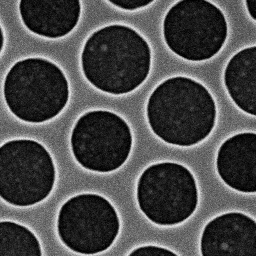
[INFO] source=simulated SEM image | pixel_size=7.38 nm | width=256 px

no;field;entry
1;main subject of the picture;holes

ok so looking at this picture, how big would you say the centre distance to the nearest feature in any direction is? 613 nanometers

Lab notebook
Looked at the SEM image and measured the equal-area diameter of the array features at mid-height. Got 469 nm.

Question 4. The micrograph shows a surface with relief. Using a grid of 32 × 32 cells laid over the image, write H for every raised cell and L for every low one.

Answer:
HHLLLLLLLLHHHHLLLLLHHHLLLLLHHHHL
HHHLLLLLLLHHHHHHHHHHHLLLLLLLHHHL
HHHLLLLLLLHHHHHHHHHHHLLLLLLLHHHH
HHHLLLLLLHHHHLLLHHHHLLLLLLLLHHHH
HHHHHHLLHHHLLLLLLLHHHLLLLLLLHHHH
HHHHHHHHHHHLLLLLLLHHHLLLLLLLHHHH
HHHHHHHHHHLLLLLLLLLHHHLLLLLHHHLL
HHHLLLHHHHLLLLLLLLLHHHHHLHHHHLLL
HLLLLLLHHHLLLLLLLLLHHHHHHHHHLLLL
HLLLLLLLHHHLLLLLLLHHHHHHHHHHLLLL
HLLLLLLLHHHHLLLLLLHHLLLLLHHHLLLL
HLLLLLLLLHHHHLLLHHHLLLLLLLHHHLLL
HLLLLLLLHHHHHHHHHHHLLLLLLLLHHLLL
HLLLLLLLHHHHHHHHHHLLLLLLLLLHHHLL
HHLLLLLHHHLLLLLHHHLLLLLLLLLHHHHH
HHHHHHHHHHLLLLLLHHHLLLLLLLLHHHHH
HHHHHHHHHLLLLLLLHHHLLLLLLLHHHHHH
HHHHHHHHHLLLLLLLHHHHLLLLLHHHLLLL
LLLLLLHHHLLLLLLLHHHHHHHHHHHHLLLL
LLLLLLHHHLLLLLLLHHHHHHHHHHHLLLLL
LLLLLLLHHHLLLLLHHHHHLLHHHHHLLLLL
LLLLLLLHHHHHHHHHHHLLLLLLHHHLLLLL
LLLLLLLHHHHHHHHHHLLLLLLLHHHHLLLL
LLLLLLHHHHHHHHHHHLLLLLLLLHHHHLLL
LLLLLLHHHHLLHHHHHLLLLLLLLHHHHHHH
HLLLHHHHLLLLLLHHHLLLLLLLLHHHHHHH
HHHHHHHLLLLLLLHHHHLLLLLLHHHHHHHH
HHHHHHHLLLLLLLLHHHHLLLLHHHHLLLLL
LLLHHHHLLLLLLLLHHHHHHHHHHHLLLLLL
LLLLHHHLLLLLLLLHHHHHHHHHHLLLLLLL
LLLLLHHHLLLLLLHHHHHHHHHHHLLLLLLL
LLLLLHHHHHLLHHHHHLLLLLHHHLLLLLLL